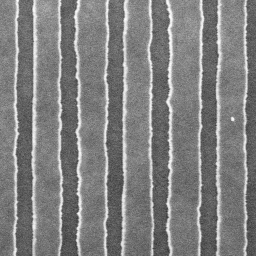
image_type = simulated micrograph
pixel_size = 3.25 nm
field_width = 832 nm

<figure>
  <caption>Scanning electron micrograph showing lines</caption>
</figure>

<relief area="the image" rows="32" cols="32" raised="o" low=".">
oo..oooo..ooo...ooo..oooo..oooo.
oo..ooo..oooo...ooo..oooo..oooo.
oo..oooo.oooo...ooo..oooo..oooo.
oo..oooo..oooo..ooo..oooo..oooo.
oo..oooo.ooooo.oooo..oooo..oooo.
oo..oooo.oooo...ooo..oooo..oooo.
oo..oooo..ooo...ooo..oooo..oooo.
oo..oooo..ooo...ooo..oooo..oooo.
oo..oooo..ooo...ooo..oooo..oooo.
oo..oooo..ooo...ooo..oooo..oooo.
oo..ooo...ooo...ooo..oooo..oooo.
oo..oooo..ooo...ooo..oooo..oooo.
oo..oooo..ooo..oooo..oooo..oooo.
oo..oooo..ooo..oooo..oooo..oooo.
oo..oooo..ooo..oooo..oooo..oooo.
oo..oooo..ooo..oooo..oooo..oooo.
oo..oooo..ooo..oooo..oooo..oooo.
oo..oooo..ooo..oooo..oooo..oooo.
oo..oooo..ooo..oooo..oooo..oooo.
oo..ooo...ooo..oooo..oooo..oooo.
oo..oooo..ooo..oooo..oooo..oooo.
oo..oooo..ooo..oooo..oooo..oooo.
oo..oooo..ooo...ooo..oooo..oooo.
oo..oooo..ooo..oooo..oooo..oooo.
oo..oooo..ooo..oooo..oooo..oooo.
oo..oooo..ooo..oooo..oooo..oooo.
oo..oooo..ooo..oooo..oooo..oooo.
oo..oooo..ooo..oooo..oooo..oooo.
oo..oooo..ooo..oooo..oooo..oooo.
oo..oooo..ooo..oooo..oooo..oooo.
oo..oooo..ooo..oooo..oooo..oooo.
oo..oooo..ooo..oooo..oooo..oooo.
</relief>